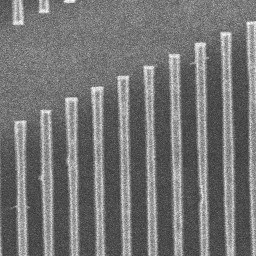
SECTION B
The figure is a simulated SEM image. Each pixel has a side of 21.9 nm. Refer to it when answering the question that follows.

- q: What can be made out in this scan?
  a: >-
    parallel lines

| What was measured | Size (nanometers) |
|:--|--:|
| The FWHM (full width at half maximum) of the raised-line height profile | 189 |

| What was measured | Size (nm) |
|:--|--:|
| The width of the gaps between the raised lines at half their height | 380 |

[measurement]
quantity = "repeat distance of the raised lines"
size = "0.567 micrometres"